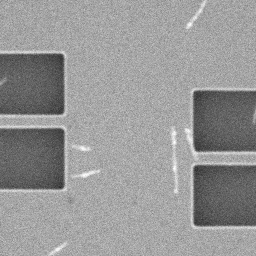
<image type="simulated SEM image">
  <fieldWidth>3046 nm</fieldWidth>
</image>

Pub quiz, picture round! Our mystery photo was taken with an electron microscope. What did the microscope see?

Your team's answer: groups of lines, slits or small figures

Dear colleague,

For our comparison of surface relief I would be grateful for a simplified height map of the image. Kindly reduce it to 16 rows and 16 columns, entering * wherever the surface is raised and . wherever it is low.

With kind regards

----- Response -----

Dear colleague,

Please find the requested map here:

****************
****************
****************
....************
....************
....************
....********....
************....
....********....
....********....
....********....
....********....
************....
************....
****************
****************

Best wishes